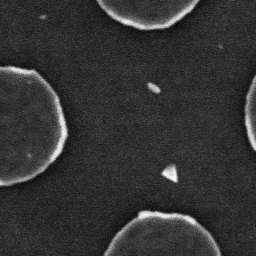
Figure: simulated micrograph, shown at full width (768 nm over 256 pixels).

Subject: raised bodies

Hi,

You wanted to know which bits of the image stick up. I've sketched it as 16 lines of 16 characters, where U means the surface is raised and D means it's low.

DDDDDDUUUUUUDDDD
DDDDDDDDUUUDDDDD
DDDDDDDDDDDDDDDD
DDDDDDDDDDDDDDDD
UUDDDDDDDDDDDDDD
UUUDDDDDDDDDDDDD
UUUUDDDDDDDDDDDU
UUUUDDDDDDDDDDDU
UUUUDDDDDDDDDDDD
UUUUDDDDDDDDDDDD
UUUDDDDDDDDDDDDD
UDDDDDDDDDDDDDDD
DDDDDDDDDDDDDDDD
DDDDDDDDDUUUDDDD
DDDDDDDUUUUUUDDD
DDDDDDDUUUUUUUDD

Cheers